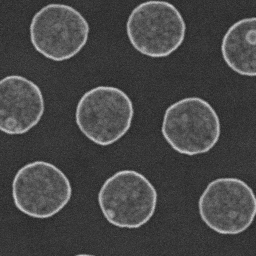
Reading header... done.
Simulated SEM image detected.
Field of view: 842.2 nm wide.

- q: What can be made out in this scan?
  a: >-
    raised bodies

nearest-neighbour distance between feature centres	87.4	pixels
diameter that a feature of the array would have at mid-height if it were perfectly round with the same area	0.182	µm